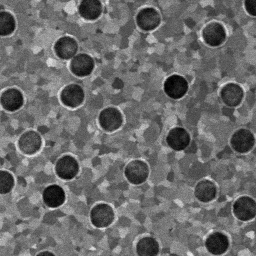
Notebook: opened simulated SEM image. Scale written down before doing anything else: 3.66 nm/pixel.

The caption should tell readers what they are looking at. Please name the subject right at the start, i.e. a regular array of holes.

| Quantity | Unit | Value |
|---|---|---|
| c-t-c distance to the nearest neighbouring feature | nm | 192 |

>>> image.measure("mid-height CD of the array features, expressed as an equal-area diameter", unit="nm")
90.1